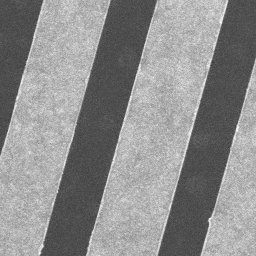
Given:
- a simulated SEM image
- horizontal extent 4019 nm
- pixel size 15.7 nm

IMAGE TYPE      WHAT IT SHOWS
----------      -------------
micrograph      one or a few lines or trenches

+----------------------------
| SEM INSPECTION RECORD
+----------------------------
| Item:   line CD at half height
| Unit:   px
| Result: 67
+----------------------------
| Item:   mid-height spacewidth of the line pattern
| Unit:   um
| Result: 0.705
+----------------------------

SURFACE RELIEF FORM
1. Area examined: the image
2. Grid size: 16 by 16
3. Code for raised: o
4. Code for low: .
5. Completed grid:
...oooo...oooo..
..oooo...ooooo..
..oooo...ooooo..
..oooo...oooo...
.ooooo...oooo...
.oooo...ooooo..o
.oooo...oooo...o
.oooo...oooo...o
ooooo..ooooo...o
oooo...ooooo..oo
oooo...oooo...oo
oooo...oooo...oo
ooo...ooooo...oo
ooo...oooo...ooo
ooo...oooo...ooo
ooo...oooo...ooo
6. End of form